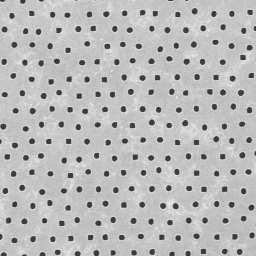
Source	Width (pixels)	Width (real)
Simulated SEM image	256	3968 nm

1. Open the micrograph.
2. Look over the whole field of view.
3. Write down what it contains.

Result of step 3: a regular array of holes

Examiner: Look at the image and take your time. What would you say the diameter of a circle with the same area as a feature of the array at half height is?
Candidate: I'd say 0.0958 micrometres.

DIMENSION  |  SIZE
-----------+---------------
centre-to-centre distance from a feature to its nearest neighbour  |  248 nanometres